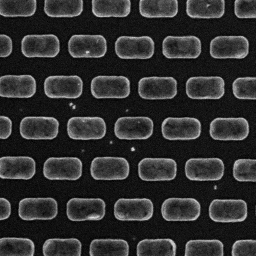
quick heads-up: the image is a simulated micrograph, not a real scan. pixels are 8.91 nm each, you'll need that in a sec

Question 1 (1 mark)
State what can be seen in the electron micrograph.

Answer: a regular array of raised bodies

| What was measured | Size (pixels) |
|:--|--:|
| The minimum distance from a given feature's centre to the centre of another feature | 46.7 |